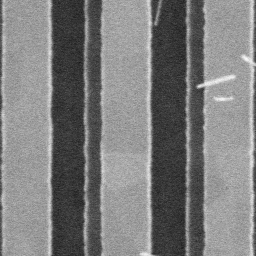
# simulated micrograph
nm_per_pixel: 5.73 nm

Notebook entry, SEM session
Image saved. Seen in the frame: lines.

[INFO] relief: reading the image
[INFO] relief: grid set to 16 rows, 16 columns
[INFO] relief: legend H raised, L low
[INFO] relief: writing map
HHHLLLHHHLLLLHHH
HHHLLLHHHLLLLHHH
HHHLLLHHHLLLLHHH
HHHLLLHHHLLLLHHH
HHHLLLHHHLLLLHHH
HHHLLLHHHLLLLHHH
HHHLLLHHHLLLLHHH
HHHLLLHHHLLLLHHH
HHHLLLHHHLLLLHHH
HHHLLLHHHLLLLHHH
HHHLLLHHHLLLLHHH
HHHLLLHHHLLLLHHH
HHHLLLHHHLLLLHHH
HHHLLLHHHLLLLHHH
HHHLLLHHHLLLLHHH
HHHLLLHHHLLLLHHH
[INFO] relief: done